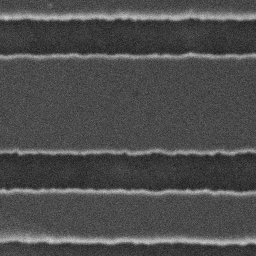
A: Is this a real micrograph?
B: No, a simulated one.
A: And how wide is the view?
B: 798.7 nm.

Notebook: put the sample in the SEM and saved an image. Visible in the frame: lines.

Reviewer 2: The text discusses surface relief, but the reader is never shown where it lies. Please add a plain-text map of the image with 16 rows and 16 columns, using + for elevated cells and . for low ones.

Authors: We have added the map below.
++++++++++++++++
................
................
.+.+++++++++++++
++++++++++++++++
++++++++++++++++
++++++++++++++++
++++++++++++++++
++++++++++++++++
++++++++++++++++
................
................
++++++++++++++++
++++++++++++++++
++++++++++++++++
................